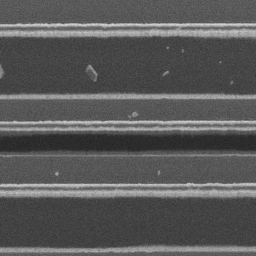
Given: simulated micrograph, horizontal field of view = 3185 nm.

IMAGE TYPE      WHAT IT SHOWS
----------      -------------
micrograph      lines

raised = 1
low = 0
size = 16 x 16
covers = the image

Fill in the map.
1111111111111111
1111111111111111
0000000000000000
0000000000000000
0000000000000000
0000000000000000
1111111111111111
1111111111111111
0000000000000000
0000000000000000
1111111111111111
1111111111111111
0000000000000000
0000000000000000
0000000000000000
0000000000000000